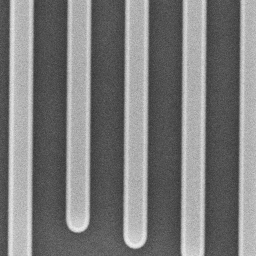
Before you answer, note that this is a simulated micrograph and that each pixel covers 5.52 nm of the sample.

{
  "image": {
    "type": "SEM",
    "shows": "groups of lines, slits or small figures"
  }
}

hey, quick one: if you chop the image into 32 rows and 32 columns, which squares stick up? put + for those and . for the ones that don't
..++.....++.....++.....++.....++
..++.....++.....++.....++.....++
..++.....++.....++.....++.....++
..++.....++.....++.....++.....++
..++.....++.....++.....++.....++
..++.....++.....++.....++.....++
..++.....++.....++.....++.....++
..++.....++.....++.....++.....++
..++.....++.....++.....++.....++
..++.....++.....++.....++.....++
..++.....++.....++.....++.....++
.+++.....++.....++.....++.....++
.+++.....++.....++.....++.....++
.+++.....++.....++.....++.....++
.+++.....++.....++.....++.....++
.+++.....++.....++.....++.....++
.+++.....++.....++.....++.....++
.+++.....++.....++.....++.....++
.+++.....++.....++.....++.....++
.+++.....++.....++.....++.....++
.+++.....++.....++.....++.....++
.+++.....++.....++.....++.....++
.+++.....++.....++.....++.....++
.+++.....++.....++.....++.....++
.+++.....++.....++.....++.....++
.+++.....++.....++.....++.....++
.+++....+++.....++.....++.....++
.+++....+++.....++.....++.....++
.+++.....+......++.....++.....++
.+++............++.....++.....++
.+++............++.....++.....++
.+++...................++.....++